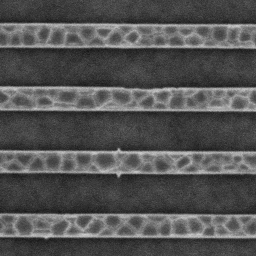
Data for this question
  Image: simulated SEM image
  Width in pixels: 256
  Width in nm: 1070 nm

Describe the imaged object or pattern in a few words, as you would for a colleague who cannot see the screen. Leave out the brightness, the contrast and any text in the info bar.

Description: one or a few lines or trenches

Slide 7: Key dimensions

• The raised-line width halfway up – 21.8 pixels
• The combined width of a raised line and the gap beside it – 264 nm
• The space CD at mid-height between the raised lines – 42 px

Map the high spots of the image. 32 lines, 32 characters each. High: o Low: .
................................
................................
................................
oooooooooooooooooooooooooooooooo
oooooooooooooooooooooooooooooooo
oooooooooooooooooooooooooooooooo
................................
................................
................................
................................
................................
oooooooooooooooooooooooooooooooo
oooooooooooooooooooooooooooooooo
oooooooooooooooooooooooooooooooo
................................
................................
................................
................................
................................
oooooooooooooooooooooooooooooooo
oooooooooooooooooooooooooooooooo
...........ooooooooooooooooooooo
................................
................................
................................
................................
................................
oooooooooooooooooooooooooooooooo
oooooooooooooooooooooooooooooooo
oooooooooooooooooooooooooooooooo
................................
................................